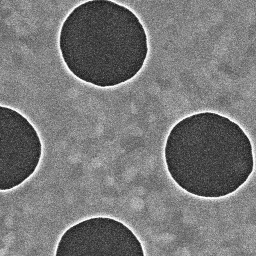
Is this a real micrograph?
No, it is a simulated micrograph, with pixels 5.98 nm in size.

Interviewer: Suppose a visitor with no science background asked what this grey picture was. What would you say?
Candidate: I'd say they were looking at holes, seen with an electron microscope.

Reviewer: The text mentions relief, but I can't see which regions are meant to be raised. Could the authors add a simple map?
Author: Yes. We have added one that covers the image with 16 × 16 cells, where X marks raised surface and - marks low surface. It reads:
XXXXX---XXXXXXXX
XXXX-----XXXXXXX
XXXX-----XXXXXXX
XXXX-----XXXXXXX
XXXX-----XXXXXXX
XXXXXXXXXXXXXXXX
XXXXXXXXXXXXXXXX
--XXXXXXXXX---XX
--XXXXXXXXX----X
---XXXXXXX------
--XXXXXXXX------
-XXXXXXXXXX----X
XXXXXXXXXXXXXXXX
XXXXXXXXXXXXXXXX
XXXX----XXXXXXXX
XXXX-----XXXXXXX